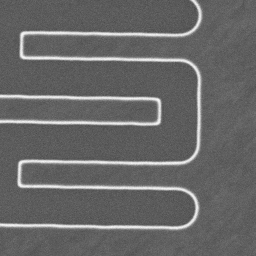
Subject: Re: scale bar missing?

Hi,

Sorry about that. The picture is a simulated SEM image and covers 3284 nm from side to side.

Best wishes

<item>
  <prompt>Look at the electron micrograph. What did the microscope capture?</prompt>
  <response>groups of lines, slits or small figures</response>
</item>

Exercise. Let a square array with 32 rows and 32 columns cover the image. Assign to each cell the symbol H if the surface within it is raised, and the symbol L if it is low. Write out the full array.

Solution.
LLLLLLLLLLLLLLLLLLLLLLLLHHHHHHHH
LLLLLLLLLLLLLLLLLLLLLLLLLHHHHHHH
LLLLLLLLLLLLLLLLLLLLLLLLLHHHHHHH
LLLLLLLLLLLLLLLLLLLLLLLLHHHHHHHH
LLLHHHHHHHHHHHHHHHHHHHHHHHHHHHHH
LLLHHHHHHHHHHHHHHHHHHHHHHHHHHHHH
LLLHHHHHHHHHHHHHHHHHHHHHHHHHHHHH
LLLLLLLLLLLLLLLLLLLLLLHHHHHHHHHH
LLLLLLLLLLLLLLLLLLLLLLLLHHHHHHHH
LLLLLLLLLLLLLLLLLLLLLLLLLHHHHHHH
LLLLLLLLLLLLLLLLLLLLLLLLLHHHHHHH
LLLLLLLLLLLLLLLLLLLLLLLLLHHHHHHH
HHHHHHHHHHHHHHHHHHHHLLLLLHHHHHHH
HHHHHHHHHHHHHHHHHHHHLLLLLHHHHHHH
HHHHHHHHHHHHHHHHHHHHLLLLLHHHHHHH
LLLLLLLLLLLLLLLLLLLLLLLLLHHHHHHH
LLLLLLLLLLLLLLLLLLLLLLLLLHHHHHHH
LLLLLLLLLLLLLLLLLLLLLLLLLHHHHHHH
LLLLLLLLLLLLLLLLLLLLLLLLLHHHHHHH
LLLLLLLLLLLLLLLLLLLLLLLLHHHHHHHH
LLLHHHHHHHHHHHHHHHHHHHHHHHHHHHHH
LLHHHHHHHHHHHHHHHHHHHHHHHHHHHHHH
LLHHHHHHHHHHHHHHHHHHHHHHHHHHHHHH
LLLLLLLLLLLLLLLLHHHHHHHHHHHHHHHH
LLLLLLLLLLLLLLLLLLLLLLLLHHHHHHHH
LLLLLLLLLLLLLLLLLLLLLLLLLHHHHHHH
LLLLLLLLLLLLLLLLLLLLLLLLLHHHHHHH
LLLLLLLLLLLLLLLLLLLLLLLLHHHHHHHH
HHHHHHHHHHHHHHHHHHHHHHHHHHHHHHHH
HHHHHHHHHHHHHHHHHHHHHHHHHHHHHHHH
HHHHHHHHHHHHHHHHHHHHHHHHHHHHHHHH
HHHHHHHHHHHHHHHHHHHHHHHHHHHHHHHH